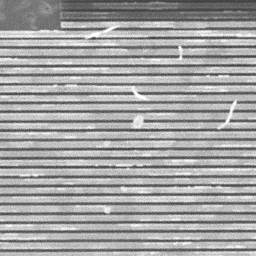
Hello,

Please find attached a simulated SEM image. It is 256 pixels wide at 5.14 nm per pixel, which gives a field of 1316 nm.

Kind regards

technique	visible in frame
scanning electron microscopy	parallel lines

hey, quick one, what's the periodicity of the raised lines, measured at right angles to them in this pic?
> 47.4 nm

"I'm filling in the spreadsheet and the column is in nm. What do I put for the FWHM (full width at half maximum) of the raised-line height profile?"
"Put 27.7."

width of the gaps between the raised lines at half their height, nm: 18.6